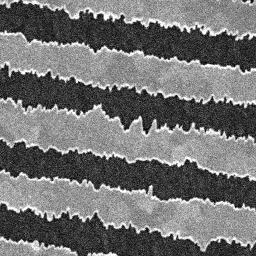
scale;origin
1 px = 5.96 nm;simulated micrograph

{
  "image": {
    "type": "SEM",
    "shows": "one or a few lines or trenches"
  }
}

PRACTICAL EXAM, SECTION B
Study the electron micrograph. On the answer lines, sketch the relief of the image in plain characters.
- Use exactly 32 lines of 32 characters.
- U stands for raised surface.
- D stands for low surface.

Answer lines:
UDDDUUUUUUUUUUUUUUUUUUUUUUUUUUUU
DDDDDDDDUUDUUUUUUUUUUUUUUUUUUUUU
DDDDDDDDDDDDDDDDUUUUUUUUUUUUUUUU
DDDDDDDDDDDDDDDDDDDDDDDUDUUUUUUU
UUUDDDDDDDDDDDDDDDDDDDDDDDDDDUDD
UUUUUUUDDUDDDDDDDDDDDDDDDDDDDDDD
UUUUUUUUUUUUUUUDDDDDDDDDDDDDDDDD
UUUUUUUUUUUUUUUUUUUUUUDDDDDDDDDD
DUUUUUUUUUUUUUUUUUUUUUUUUUUUUUDD
DDDDDDDUUUUUUUUUUUUUUUUUUUUUUUUU
DDDDDDDDDDDUUUUUUUUUUUUUUUUUUUUU
DDDDDDDDDDDDDDDDDDDUUUUUUUUUUUUU
DDDDDDDDDDDDDDDDDDDDDDDDDUDUDUUU
UUUDUDDDDDDDUDDDDDDDDDDDDDDDDDDD
UUUUUUUUUUUUUDDDDDDDDDDDDDDDDDDD
UUUUUUUUUUUUUUUDUUDDDDDDDDDDDDDD
UUUUUUUUUUUUUUUUUUDUUUUUUUUDDDDD
UUUUUUUUUUUUUUUUUUUUUUUUUUUUUUUU
DDDDDUDUUUUUUUUUUUUUUUUUUUUUUUUU
DDDDDDDDDDDDDDDUUUUUUUUUUUUUUUUU
DDDDDDDDDDDDDDDDDDDDDUUDDUUUUUUU
UDDDDDDDDDDDDDDDDDDDDDDDDDDUUUUU
UUUUUUDUDDDDDDDDDDDDDDDDDDDDDDDD
UUUUUUUUUUUUUUDDDDDDDDDDDDDDDDDD
UUUUUUUUUUUUUUUUUUUDDDDDDDDDDDDD
DUUUUUUUUUUUUUUUUUUUUUUUUUUUUDDD
DDDDDUUUUUUUUUUUUUUUUUUUUUUUUUUU
DDDDDDDDDDDDDUUUUUUUUUUUUUUUUUUU
DDDDDDDDDDDDDDDDDUUUUUUUUUUUUUUU
DDDDDDDDDDDDDDDDDDDDDDUUUUUUUUUU
UUUUUDDDDDDDDDDDDDDDDDDDDUDDDDUD
UUUUUUUUUDDDDDDDDDDDDDDDDDDDDDDD